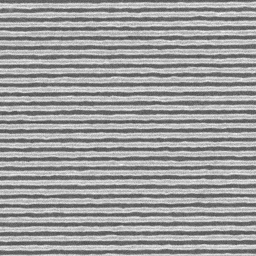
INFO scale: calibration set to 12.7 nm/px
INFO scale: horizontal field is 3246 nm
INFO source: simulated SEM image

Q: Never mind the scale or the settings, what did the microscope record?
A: parallel lines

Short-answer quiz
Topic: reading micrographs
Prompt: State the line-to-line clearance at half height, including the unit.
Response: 4.75 pixels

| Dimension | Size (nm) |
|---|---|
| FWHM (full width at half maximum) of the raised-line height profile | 60.2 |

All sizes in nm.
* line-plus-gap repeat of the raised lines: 118